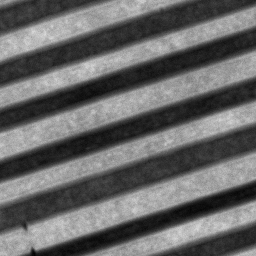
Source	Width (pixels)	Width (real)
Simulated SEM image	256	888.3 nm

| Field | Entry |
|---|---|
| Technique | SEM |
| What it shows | parallel lines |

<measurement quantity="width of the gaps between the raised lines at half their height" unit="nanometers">73.5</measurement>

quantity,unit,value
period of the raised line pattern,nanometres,163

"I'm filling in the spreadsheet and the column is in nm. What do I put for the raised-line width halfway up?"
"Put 80.5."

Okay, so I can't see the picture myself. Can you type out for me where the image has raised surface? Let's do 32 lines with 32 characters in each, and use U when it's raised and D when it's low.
UDDDDDDDDDDDUUUUUUUUUUUDDDDDDDDD
DDDDDDDDDUUUUUUUUUUDDDDDDDDDDUUU
DDDDDDUUUUUUUUUUDDDDDDDDDDUUUUUU
DDDUUUUUUUUUUDDDDDDDDDDUUUUUUUUU
UUUUUUUUUUDDDDDDDDDDUUUUUUUUUDDD
UUUUUUUDDDDDDDDDDUUUUUUUUDDDDDDD
UUUUDDDDDDDDDDUUUUUUUUDDDDDDDDDU
UDDDDDDDDDDUUUUUUUUDDDDDDDDDUUUU
DDDDDDDDUUUUUUUUDDDDDDDDDUUUUUUU
DDDDUUUUUUUUUDDDDDDDDUUUUUUUUUUU
DUUUUUUUUUDDDDDDDDDUUUUUUUUUUUDD
UUUUUUUDDDDDDDDUUUUUUUUUUUUDDDDD
UUUUDDDDDDDDUUUUUUUUUUUDDDDDDDDD
UDDDDDDDDUUUUUUUUUUUDDDDDDDDDUUU
DDDDDDUUUUUUUUUUUDDDDDDDDDUUUUUU
DDDUUUUUUUUUUUDDDDDDDDDUUUUUUUUU
UUUUUUUUUUUDDDDDDDDDUUUUUUUUUDDD
UUUUUUUUDDDDDDDDUUUUUUUUUDDDDDDD
UUUUUDDDDDDDDUUUUUUUUUDDDDDDDDDD
UUDDDDDDDDUUUUUUUUUDDDDDDDDDDDUU
DDDDDDDUUUUUUUUUDDDDDDDDDDDUUUUU
DDDDUUUUUUUUUDDDDDDDDDDDUUUUUUUU
DUUUUUUUUUDDDDDDDDDDDUUUUUUUUUUU
UUUUUUUDDDDDDDDDDDUUUUUUUUUUUUDD
UUUUDDDDDDDDDDDUUUUUUUUUUUUDDDDD
UDDDDDDDDDDDUUUUUUUUUUUDDDDDDDUU
DDDDDDDDUUUUUUUUUUUUDDDDDDDUUUUU
DDDDDUUUUUUUUUUUUDDDDDDUUUUUUUUU
DDDUUUUUUUUUUUDDDDDDDUUUUUUUUUDD
UUUUUUUUUUUDDDDDDDUUUUUUUUUDDDDD
UUUUUUUUDDDDDDDUUUUUUUUUDDDDDDDD
UUUUDDDDDDDDUUUUUUUUDDDDDDDDDDUU